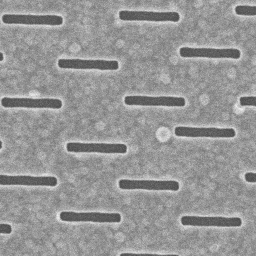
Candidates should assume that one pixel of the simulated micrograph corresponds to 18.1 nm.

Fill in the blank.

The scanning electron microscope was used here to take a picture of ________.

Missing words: a regular array of holes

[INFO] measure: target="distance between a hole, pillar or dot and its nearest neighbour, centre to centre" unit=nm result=1240